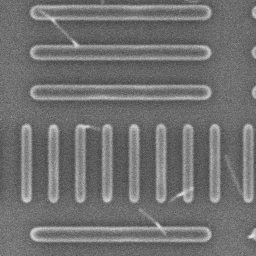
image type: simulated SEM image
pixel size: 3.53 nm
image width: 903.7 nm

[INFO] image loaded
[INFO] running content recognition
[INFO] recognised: groups of lines, slits or small figures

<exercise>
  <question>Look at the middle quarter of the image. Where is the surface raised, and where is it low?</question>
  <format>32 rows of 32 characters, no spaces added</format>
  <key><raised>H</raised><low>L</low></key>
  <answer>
LLLLLLLLLLLLLLLLLLLLLLLLLLLLLLLL
LLLLLLLLLLLLLLLLLLLLLLLLLLLLLLLL
LLLLLLLLLLLLLLLLLLLLLLLLLLLLLLLL
LLLLLLLLLLLLLLLLLLLLLLLLLLLLLLLL
LLLLLLLLLLLLLLLLLLLLLLLLLLLLLLLL
HHHHHHHHHLHHHHHHHHLLLLHHHHHHHHHH
HHHHHHHHHHHHHHHHHHHHHHHHHHHHHHHH
HHHHHHHHHHHHHHHHHHHHHHHHHHHHHHHH
HHHHHHHHHHHHHHHHHHHHHHHHHHHHHHHH
LLLLLLLLLLLLLLLLLLLLLLLLLLLLLLLL
LLLLLLLLLLLLLLLLLLLLLLLLLLLLLLLL
LLLLLLLLLLLLLLLLLLLLLLLLLLLLLLLL
LLLLLLLLLLLLLLLLLLLLLLLLLLLLLLLL
LLLLLLLLLLLLLLLLLLLLLLLLLLLLLLLL
LLLLLLLLLLLLLLLLLLLLLLLLLLLLLLLL
LLLLHLLLLLHLLLLLLHLLLLLLHLLLLLHH
LLLHHLLLLLHHLLLLLHHLLLLHHLLLLLHH
LLLHHLLLLLHHLLLLLHHLLLLHHLLLLLHH
LLLHHLLLLLHHLLLLLHHLLLLHHLLLLLHH
LLLHHLLLLLHHLLLLLHHLLLLHHLLLLLHH
LLLHHLLLLLHHLLLLLHHLLLLHHLLLLLHH
LLLHHLLLLLHHLLLLLHHLLLLHHLLLLLHH
LLLHHLLLLLHHLLLLLHHLLLLHHLLLLLHH
LLLHHLLLLLHHLLLLLHHLLLLHHLLLLLHH
LLLHHLLLLLHHLLLLLHHLLLLHHLLLLLHH
LLLHHLLLLLHHLLLLLHHLLLLHHLLLLLHH
LLLHHLLLLLHHLLLLLHHLLLLHHLLLLLHH
LLLHHLLLLLHHLLLLLHHLLLLHHLLLLLHH
LLLHHLLLLLHHLLLLLHHLLLLHHLLLLLHH
LLLHHLLLLLHHLLLLLHHLLLLHHLLLLLHH
LLLHHLLLLLHHLLLLLHHLLLLHHLLLLLHH
LLLHHLLLLLHHLLLLLHHLLLLHHLLLLLHH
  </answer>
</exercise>